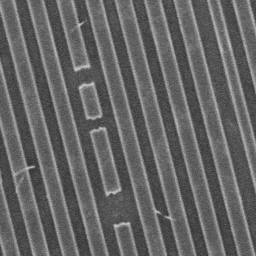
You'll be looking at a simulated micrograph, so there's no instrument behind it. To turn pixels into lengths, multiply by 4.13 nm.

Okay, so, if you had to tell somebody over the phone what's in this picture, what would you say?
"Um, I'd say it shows parallel lines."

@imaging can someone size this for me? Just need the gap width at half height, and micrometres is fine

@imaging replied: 0.0516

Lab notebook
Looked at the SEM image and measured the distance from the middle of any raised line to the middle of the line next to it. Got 118 nanometres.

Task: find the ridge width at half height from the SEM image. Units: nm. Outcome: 66.1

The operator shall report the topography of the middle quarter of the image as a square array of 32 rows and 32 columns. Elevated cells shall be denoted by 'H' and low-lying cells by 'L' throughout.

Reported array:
LLHHHHLLLHHHHHLLLHHHHLLLHHHHLLLL
LLLLLLLLLLHHHHLLLHHHHLLLHHHHHLLL
LLLLLLLLLLHHHHLLLHHHHHLLLHHHHLLL
LLLLLLLLLLHHHHHLLLHHHHLLLHHHHLLL
LLLLLLLLLLHHHHHLLLHHHHLLLHHHHLLL
LLLLHHHHLLLHHHHLLLHHHHLLLHHHHHLL
HLLLHHHHLLLHHHHLLLHHHHHLLLHHHHLL
HLLLHHHHLLLHHHHHLLLHHHHLLLHHHHLL
HLLLHHHHLLLLHHHHLLLHHHHLLLHHHHLL
HLLLLHHHHLLLHHHHLLLHHHHLLLHHHHHL
HHLLLHHHHLLLHHHHLLLHHHHHLLLHHHHL
HHLLLHHHHLLLHHHHHLLLHHHHLLLHHHHL
HHLLLHHHHLLLLHHHHLLLHHHHLLLHHHHH
HHLLLLHHLLLLLHHHHLLLHHHHLLLHHHHH
HHHLLLLLLLLLLHHHHLLLHHHHHLLLHHHH
HHHLLLLLLLLLLHHHHHLLLHHHHLLLHHHH
HHHLLLLHHHLLLLHHHHLLLHHHHLLLHHHH
HHHLLLLHHHHLLLHHHHLLLHHHHLLLLHHH
HHHHLLLHHHHLLLHHHHLLLHHHHHLLLHHH
HHHHLLLHHHHLLLHHHHHLLLHHHHLLLHHH
HHHHLLLHHHHLLLLHHHHLLLHHHHLLLHHH
HHHHLLLLHHHHLLLHHHHLLLHHHHLLLLHH
LHHHHLLLHHHHLLLHHHHLLLHHHHHLLLHH
LHHHHLLLHHHHLLLHHHHHLLLHHHHLLLHH
LHHHHLLLHHHHLLLLHHHHLLLHHHHLLLHH
LHHHHLLLLHHHHLLLHHHHLLLHHHHLLLLH
LLHHHHLLLHHHHLLLHHHHLLLHHHHHLLLH
LLHHHHLLLHHHHLLLHHHHHLLLHHHHLLLH
LLHHHHLLLHHHHLLLLHHHHLLLHHHHLLLH
LLHHHHLLLLHHHHLLLHHHHLLLHHHHLLLL
LLLHHHHLLLHHHHLLLHHHHLLLHHHHLLLL
LLLHHHHLLLHHHHLLLHHHHHLLLHHHHLLL